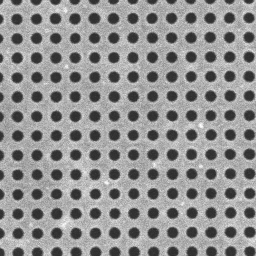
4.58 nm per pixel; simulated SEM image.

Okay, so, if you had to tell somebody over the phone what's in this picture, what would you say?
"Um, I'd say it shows a regular array of holes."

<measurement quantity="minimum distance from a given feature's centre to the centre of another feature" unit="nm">87.6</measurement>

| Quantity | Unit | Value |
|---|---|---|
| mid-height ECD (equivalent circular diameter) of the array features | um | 0.052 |